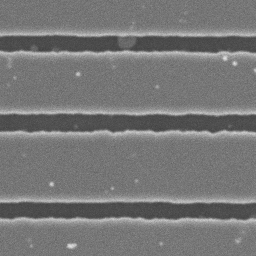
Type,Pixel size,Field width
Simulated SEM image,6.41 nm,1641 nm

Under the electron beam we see lines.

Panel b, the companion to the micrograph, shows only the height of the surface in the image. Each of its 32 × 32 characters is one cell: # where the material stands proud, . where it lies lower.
################################
################################
################################
################################
................................
................................
####...##.##.###########...####.
################################
################################
################################
################################
################################
################################
################################
................................
................................
..#..#......##.####.######.####.
################################
################################
################################
################################
################################
################################
################################
################################
................................
................................
##############################.#
################################
################################
################################
################################